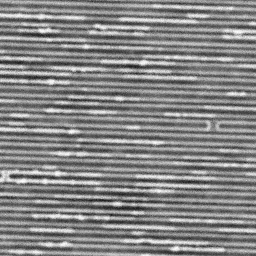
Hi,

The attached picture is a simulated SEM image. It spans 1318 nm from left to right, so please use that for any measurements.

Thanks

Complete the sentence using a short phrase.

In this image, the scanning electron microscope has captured parallel lines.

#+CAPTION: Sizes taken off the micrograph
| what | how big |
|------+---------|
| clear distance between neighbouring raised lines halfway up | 0.0283 microns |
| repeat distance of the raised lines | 7.09 px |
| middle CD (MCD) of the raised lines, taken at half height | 14.2 nm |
